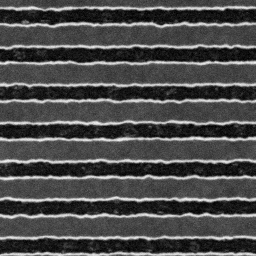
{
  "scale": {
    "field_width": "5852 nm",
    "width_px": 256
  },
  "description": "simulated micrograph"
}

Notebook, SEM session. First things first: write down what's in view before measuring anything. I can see parallel lines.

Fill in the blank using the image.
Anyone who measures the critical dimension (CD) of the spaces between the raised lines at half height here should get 15.6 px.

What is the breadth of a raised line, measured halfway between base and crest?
0.514 micrometres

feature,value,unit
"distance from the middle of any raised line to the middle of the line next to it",874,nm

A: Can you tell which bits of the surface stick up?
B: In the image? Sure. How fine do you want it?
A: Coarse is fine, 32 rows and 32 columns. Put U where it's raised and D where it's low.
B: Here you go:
UUUUUUUUUUUUUUUUUUUUUUUUUUUUUUUU
DDDDDDDDDDDDDDDDDDDDDDDDDDDDDDDD
DDDDDDDDDDDDDDDDDDDDDDDDDDDDDDDD
UUUUUUUUUUUUUUUUUUUUUUUUUUUUUUUU
UUUUUUUUUUUUUUUUUUUUUUUUUUUUUUUU
UUUUUUUUUUUUUUUUUUUUUUUUUUUUUUUU
DDDDDDDDDDDDDDDDDDDDDDDDDDDDDDDD
DDDDDDDDDDDDDDDDDDDDDDDDDDDDDDDD
UUUUUUUUUUUUUUUUUUUUUUUUUUUUUUUU
UUUUUUUUUUUUUUUUUUUUUUUUUUUUUUUU
UUUUUUUUUUUUUUUUUUUUUUUUUUUUUUUU
DDDDDDDDDDDDDDDDDDDDDDDDDDDDDDDD
DDDDDDDDDDDDUDDDDDDDDDDDDDDDDUDD
UUUUUUUUUUUUUUUUUUUUUUUUUUUUUUUU
UUUUUUUUUUUUUUUUUUUUUUUUUUUUUUUU
DDDDDDDDDDDDUDDDDDDDDDDDUUDUDDDD
DDDDDDDDDDDDDDDDDDDDDDDDDDDDDDDD
UUUUUUUUUUUUUUUUUUUUUUUUUUUUUUUU
UUUUUUUUUUUUUUUUUUUUUUUUUUUUUUUU
UUUUUUUUUUUUUUUUUUUUUUUUUUUUUUUU
DDDDDDDDDDDDDDDDDDDDDDDDDDDDDDDD
DDDDDDDDDDDDDDDDDDDDDDDDDDDDDDDD
UUUUUUUUUUUUUUUUUUUUUUUUUUUUUUUU
UUUUUUUUUUUUUUUUUUUUUUUUUUUUUUUU
UUUUUUUUUUUUUUUUUUUUUUUUUUUUUUUU
DDDDDDDDDDDDDDDDDDDDDDDDDDDDDDDD
DDDDDDDDDDDDDDDDDDDDDDDDDDDDDDDD
UUUUUUUUUUUUUUUUUUUUUUUUUUUUUUUU
UUUUUUUUUUUUUUUUUUUUUUUUUUUUUUUU
UUUUUUUUUUUUUUUUUUUUUUUUUUUUUUUU
DDDDDDDDDDDDDDDDDDDDDDDDDDDDDDDD
DDDDDDDDDDDDDDDDDDDDDDDDDDDDDDDD